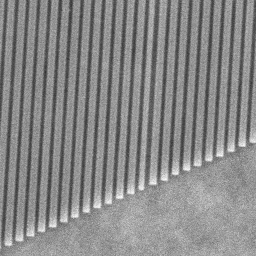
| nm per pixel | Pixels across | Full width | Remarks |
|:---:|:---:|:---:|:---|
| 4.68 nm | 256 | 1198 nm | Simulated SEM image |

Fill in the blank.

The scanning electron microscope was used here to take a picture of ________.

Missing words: parallel lines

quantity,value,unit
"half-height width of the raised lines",0.0309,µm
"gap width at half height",3.87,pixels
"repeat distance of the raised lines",0.0507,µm